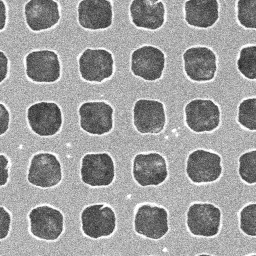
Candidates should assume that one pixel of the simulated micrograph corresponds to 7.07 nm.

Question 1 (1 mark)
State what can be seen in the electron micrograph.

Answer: a regular array of holes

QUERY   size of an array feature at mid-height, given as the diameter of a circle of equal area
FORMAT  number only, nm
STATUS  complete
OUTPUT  248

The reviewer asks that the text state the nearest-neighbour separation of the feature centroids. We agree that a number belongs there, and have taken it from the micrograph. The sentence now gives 367 nm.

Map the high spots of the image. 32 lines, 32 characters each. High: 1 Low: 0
01100001110000110000111000011100
01100001110000110000011000011100
01100001110000110000011000011100
11110011111001111100111110111110
11111111111111111111111111111111
11111111111111111111111111111111
11110001110001111000111000011100
01100001110000110000011000011100
01100000110000110000111000011100
01110001110000111000111000011100
11111111111111111111111111111111
11111111111111111111111111111111
11111111111111111001111100111110
01110001110000111000111000011100
01100000110000111000011000001100
01110000110000111000011000011100
01110001111000111000111111111111
11111111111111111111111111111111
11111111111111111111111111111111
01110001111000111000111100011100
01110001110000111000011000001100
01110000110000111000011000001100
01110000110000111000011100011100
11111111111111111111111111111111
11111111111111111111111111111111
11111111111111111111111100111110
01110000110000111000011000011100
01110000110000111000011000001100
01110000110000111000011100011100
01110001111000111100111110011111
11111111111111111111111111111111
11111111111111111111111111111111